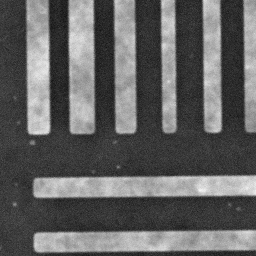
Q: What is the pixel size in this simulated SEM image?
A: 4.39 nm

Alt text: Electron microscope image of groups of lines, slits or small figures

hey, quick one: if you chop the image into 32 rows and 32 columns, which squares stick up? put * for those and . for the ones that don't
...***...***..***...**...**....*
...***...***..***...**...***...*
...***...***..***...**...***...*
...***...***..***...**...***...*
...***...***..***...**....**...*
...***...***..***...**....**...*
...***...***..***...**....**...*
...***...***..***...**....**...*
...***...***..***...**....**...*
...***...***..***...**....**...*
...***...***..***...**....**...*
...***...***...**...**....**...*
...***...***...**...**....**...*
...***...***...**...**....**...*
...***...***...**...**....**...*
...***...***...**...**....**...*
....**...***...**....*....*.....
................................
................................
................................
................................
................................
....****************************
....****************************
.....**********.................
................................
................................
................................
................................
....****************************
....****************************
................................